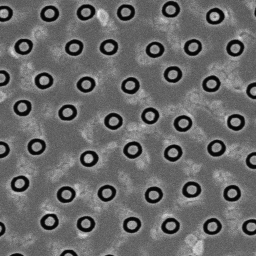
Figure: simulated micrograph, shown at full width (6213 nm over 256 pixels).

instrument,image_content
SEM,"a regular array of ring-shaped grooves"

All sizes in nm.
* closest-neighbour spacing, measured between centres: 866